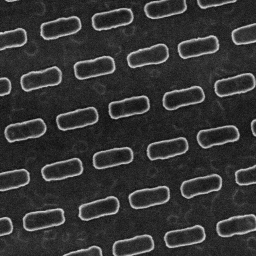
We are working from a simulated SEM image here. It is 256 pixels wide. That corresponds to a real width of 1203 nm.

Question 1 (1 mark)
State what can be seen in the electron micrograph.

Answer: a regular array of raised bodies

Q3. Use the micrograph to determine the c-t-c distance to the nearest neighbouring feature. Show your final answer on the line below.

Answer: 244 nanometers